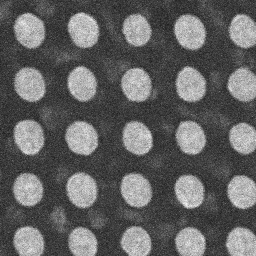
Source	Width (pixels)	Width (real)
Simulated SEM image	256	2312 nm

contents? a regular array of raised bodies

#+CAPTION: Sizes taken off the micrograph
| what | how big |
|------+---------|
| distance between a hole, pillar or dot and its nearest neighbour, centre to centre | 0.474 microns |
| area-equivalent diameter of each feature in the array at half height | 279 nanometers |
